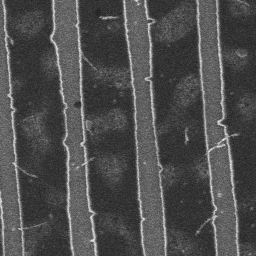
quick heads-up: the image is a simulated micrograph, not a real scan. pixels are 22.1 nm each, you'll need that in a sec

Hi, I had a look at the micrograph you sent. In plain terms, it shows one or a few lines or trenches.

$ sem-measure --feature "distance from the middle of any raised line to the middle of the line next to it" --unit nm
1570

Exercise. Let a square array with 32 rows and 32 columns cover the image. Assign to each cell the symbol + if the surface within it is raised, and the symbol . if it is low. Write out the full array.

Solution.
+++++++...++++++..+++++++..+++++
.++++++...++++++..+++++++..+++++
.++++++...++++++...++++++..+++++
.++++++...++++++...++++++..+++++
.++++++...++++++...++++++..+++++
.++++++...++++++...++++++..+++++
.++++++...++++++...++++++..+++++
.++++++...++++++...++++++..+++++
.++++++...++++++...++++++...++++
.+++++++..+++++++..++++++...++++
.+++++++..+++++++..++++++...++++
.+++++++..+++++++..++++++...++++
.+++++++..+++++++..++++++...++++
..++++++..+++++++..+++++++..++++
..++++++..+++++++..+++++++..++++
..++++++..+++++++..+++++++..++++
..++++++..+++++++..+++++++..++++
..++++++..+++++++..+++++++..++++
..++++++..+++++++...++++++...+++
..+++++++..++++++...++++++...+++
..++++++...++++++...++++++...+++
..+++++++..++++++...++++++...+++
..+++++++..++++++...++++++...+++
..+++++++..++++++...++++++...+++
..+++++++..++++++...+++++++..+++
..+++++++..+++++++..+++++++..+++
...++++++..+++++++..+++++++..+++
...++++++..+++++++..+++++++...++
...++++++...++++++...++++++...++
...++++++...++++++...++++++...++
...++++++...++++++...++++++...++
...++++++...++++++...++++++...++